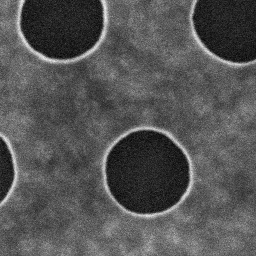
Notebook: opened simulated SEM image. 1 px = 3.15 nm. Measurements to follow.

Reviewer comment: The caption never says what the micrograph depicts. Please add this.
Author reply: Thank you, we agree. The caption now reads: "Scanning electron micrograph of holes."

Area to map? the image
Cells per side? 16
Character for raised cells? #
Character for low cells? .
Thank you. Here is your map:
#.....######....
#......#####....
##....######....
###..#########..
################
################
################
################
########..######
.######....#####
.######.....####
.######.....####
#######....#####
################
################
################